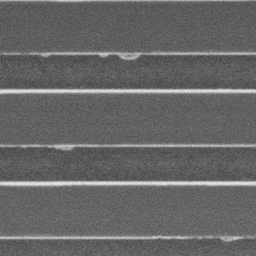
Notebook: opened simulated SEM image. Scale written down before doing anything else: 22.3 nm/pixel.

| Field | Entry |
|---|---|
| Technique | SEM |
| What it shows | lines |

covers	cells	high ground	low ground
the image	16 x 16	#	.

################
################
################
................
................
................
################
################
################
................
................
....############
################
################
################
................